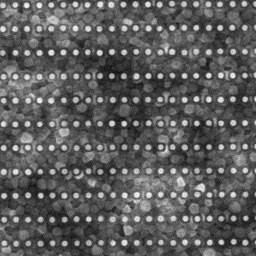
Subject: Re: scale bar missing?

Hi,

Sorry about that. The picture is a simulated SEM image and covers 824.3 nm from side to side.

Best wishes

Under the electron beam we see a regular array of raised bodies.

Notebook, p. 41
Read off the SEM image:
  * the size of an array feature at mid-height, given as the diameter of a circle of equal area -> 0.017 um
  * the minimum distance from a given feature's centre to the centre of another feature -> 27.5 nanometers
